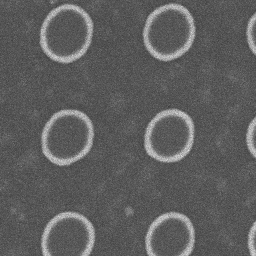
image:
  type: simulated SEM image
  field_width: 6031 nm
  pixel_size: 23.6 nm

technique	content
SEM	raised bodies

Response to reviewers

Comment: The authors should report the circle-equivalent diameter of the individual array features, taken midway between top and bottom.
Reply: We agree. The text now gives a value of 1170 nanometers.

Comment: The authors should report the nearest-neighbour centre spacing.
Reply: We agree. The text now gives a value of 2410 nanometres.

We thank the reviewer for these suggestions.